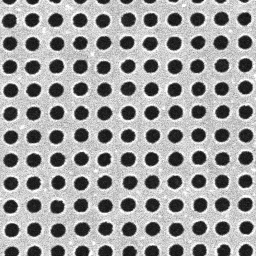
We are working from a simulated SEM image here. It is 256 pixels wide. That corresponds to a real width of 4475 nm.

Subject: a regular array of holes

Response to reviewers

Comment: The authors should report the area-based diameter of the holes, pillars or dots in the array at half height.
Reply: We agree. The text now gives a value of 264 nm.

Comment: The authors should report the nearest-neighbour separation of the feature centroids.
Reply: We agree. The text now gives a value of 395 nm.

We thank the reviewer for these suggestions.